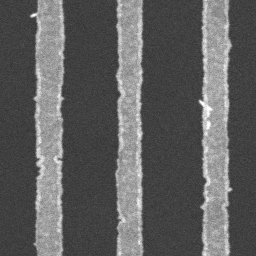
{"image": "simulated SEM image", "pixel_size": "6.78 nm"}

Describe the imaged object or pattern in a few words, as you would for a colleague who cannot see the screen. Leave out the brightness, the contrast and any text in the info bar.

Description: one or a few lines or trenches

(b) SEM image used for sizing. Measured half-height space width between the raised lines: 405 nanometers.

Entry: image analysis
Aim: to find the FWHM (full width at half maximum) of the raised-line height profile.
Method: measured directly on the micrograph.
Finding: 166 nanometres